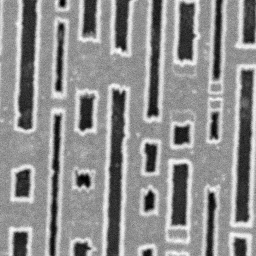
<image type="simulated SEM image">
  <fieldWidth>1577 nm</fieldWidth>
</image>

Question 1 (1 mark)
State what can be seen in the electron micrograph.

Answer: parallel lines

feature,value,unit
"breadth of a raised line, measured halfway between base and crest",107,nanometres